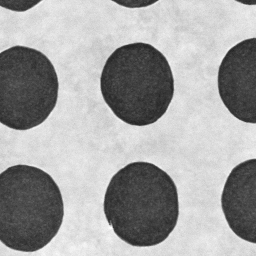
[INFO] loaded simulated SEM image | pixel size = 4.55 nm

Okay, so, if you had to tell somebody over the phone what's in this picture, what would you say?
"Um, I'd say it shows holes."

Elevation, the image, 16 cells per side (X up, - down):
--XXXXXXXXXXXXXX
XXXXXXXXXXXXXXXX
XXXXXXXXXXXXXXX-
---XXXX---XXXX--
---XXX-----XXX--
----XX-----XXX--
---XXXX----XXX--
---XXXXX--XXXXX-
XXXXXXXXXXXXXXXX
XXXXXXXXXXXXXXXX
X-XXXXXX--XXXXX-
----XXX----XXX--
----XXX----XXX--
----XXX----XXX--
----XXX----XXXX-
X--XXXXXXXXXXXXX